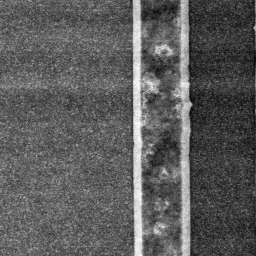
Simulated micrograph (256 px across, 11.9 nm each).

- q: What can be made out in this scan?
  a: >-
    one or a few lines or trenches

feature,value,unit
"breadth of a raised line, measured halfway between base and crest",586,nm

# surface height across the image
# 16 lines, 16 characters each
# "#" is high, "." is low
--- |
.........###....
.........###....
.........###....
.........###....
.........###....
.........###....
.........###....
.........###....
.........###....
.........###....
.........###....
.........###....
.........###....
.........###....
.........###....
.........###....